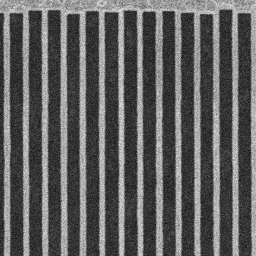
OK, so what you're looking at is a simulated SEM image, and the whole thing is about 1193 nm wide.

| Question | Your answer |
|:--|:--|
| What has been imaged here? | parallel lines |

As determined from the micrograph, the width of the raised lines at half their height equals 0.0204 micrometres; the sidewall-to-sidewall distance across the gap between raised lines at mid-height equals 67.6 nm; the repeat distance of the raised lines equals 88.7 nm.